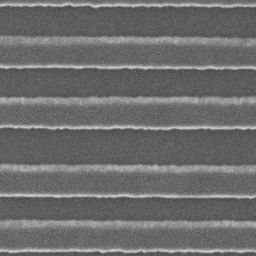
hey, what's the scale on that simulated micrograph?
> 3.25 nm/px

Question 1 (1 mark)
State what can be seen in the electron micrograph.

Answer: lines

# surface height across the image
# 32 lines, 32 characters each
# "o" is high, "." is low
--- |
oooooooooooooooooooooooooooooooo
................................
................................
................................
................................
oooooooooooooooooooooooooooooooo
oooooooooooooooooooooooooooooooo
oooooooooooooooooooooooooooooooo
o........oo.oooooooooooooooooooo
................................
................................
................................
ooo.oooooo.ooooooooooooooooooooo
oooooooooooooooooooooooooooooooo
oooooooooooooooooooooooooooooooo
oooooooooooooooooooooooooooooooo
................................
................................
................................
................................
................................
oooooooooooooooooooooooooooooooo
oooooooooooooooooooooooooooooooo
oooooooooooooooooooooooooooooooo
oooooooooooooooooooooooooooooooo
................................
................................
................................
oooooooooooooooooooooooooooooooo
oooooooooooooooooooooooooooooooo
oooooooooooooooooooooooooooooooo
.oo..........o.oooo..oo..oo..oo.